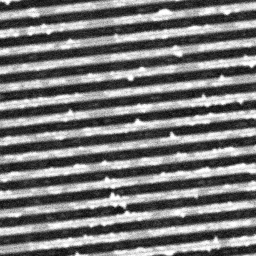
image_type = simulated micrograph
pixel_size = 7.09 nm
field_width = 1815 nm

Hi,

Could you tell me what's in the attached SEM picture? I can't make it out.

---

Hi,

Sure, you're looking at parallel lines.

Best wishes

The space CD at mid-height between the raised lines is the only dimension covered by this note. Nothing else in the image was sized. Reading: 80.1 nm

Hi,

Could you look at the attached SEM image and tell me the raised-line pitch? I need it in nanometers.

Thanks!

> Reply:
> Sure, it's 127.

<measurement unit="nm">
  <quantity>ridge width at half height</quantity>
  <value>46.6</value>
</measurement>